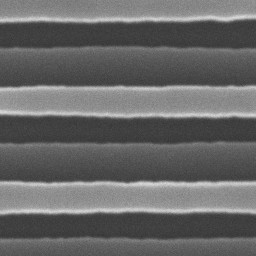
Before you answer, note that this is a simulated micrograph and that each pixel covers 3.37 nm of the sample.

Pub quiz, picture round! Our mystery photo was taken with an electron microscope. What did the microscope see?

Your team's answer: lines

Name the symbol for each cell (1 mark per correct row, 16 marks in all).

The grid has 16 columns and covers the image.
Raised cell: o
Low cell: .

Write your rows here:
oooooooooooooooo
................
................
................
................
.ooooooooooooooo
oooooooooooooooo
................
................
................
................
oooooooooooooooo
oooooooooooooooo
................
................
................